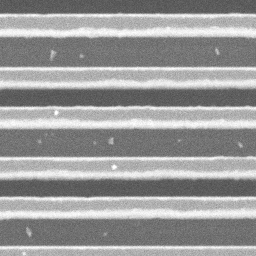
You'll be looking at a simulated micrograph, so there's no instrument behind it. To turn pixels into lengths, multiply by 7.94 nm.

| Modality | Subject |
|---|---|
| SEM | lines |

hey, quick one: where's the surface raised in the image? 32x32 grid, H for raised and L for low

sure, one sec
LLLLLLLLLLLLLLLLLLLLLLLLLLLLLLLL
LLLLLLLLLLLLLLLLLLLLLLLLLLLLLLLL
HHHHHHHHHHHHHHHHHHHHHHHHHHHHHHHH
HHHHHHHHHHHHHHHHHHHHHHHHHHHHHHHH
LLLLLLLLLLLLLLLLLLLLLLLLLLLLLLLL
LLLLLLLLLLLLLLLLLLLLLLLLLLLLLLLL
LLLLLLLLLLLLLLLLLLLLLLLLLLLLLLLL
LLLLLLLLLLLLLLLLLLLLLLLLLLLLLLLL
HHHHHHHHHHHHHHHHHHHHHHHHHHHHHHHH
HHHHHHHHHHHHHHHHHHHHHHHHHHHHHHHH
HHHHHHHHHHHHHHHHHHHHHHHHHHHHHHHH
LLLLLLLLLLLLLLLLLLLLLLLLLLLLLLLL
LLLLLLLLLLLLLLLLLLLLLLLLLLLLLLLL
HHHHHHHHHHHHHHHHHHHHHHHHHHHHHHHH
HHHHHHHHHHHHHHHHHHHHHHHHHHHHHHHH
HHHHHHHHHHHHHHHHHHHHHHHHHHHHHHHH
LLLLLLLLLLLLLLLLLLLLLLLLLLLLLLLL
LLLLLLLLLLLLLLLLLLLLLLLLLLLLLLLL
LLLLLLLLLLLLLLLLLLLLLLLLLLLLLLLL
LLLLLLLLLLLLLLLLLLLLLLLLLLLLLLLL
HHHHHHHHHHHHHHHHHHHHHHHHHHHHHHHH
HHHHHHHHHHHHHHHHHHHHHHHHHHHHHHHH
LLLLLLLLLLLLLLLLLLLLLLLLLLLLLLLL
LLLLLLLLLLLLLLLLLLLLLLLLLLLLLLLL
LLLLLLLLLLLLLLLLLLLLLLLLLLLLLLLL
HHHHHHHHHHHHHHHHHHHHHHHHHHHHHHHH
HHHHHHHHHHHHHHHHHHHHHHHHHHHHHHHH
LLLLLLLLLLLLLLLLLLLLLLLLLLLLLLLL
LLLLLLLLLLLLLLLLLLLLLLLLLLLLLLLL
LLLLLLLLLLLLLLLLLLLLLLLLLLLLLLLL
LLLLLLLLLLLLLLLLLLLLLLLLLLLLLLLL
HHHHHHHHHHHHHHHHHHHHHHHHHHHHHHHH